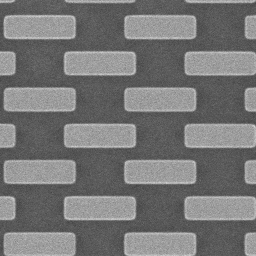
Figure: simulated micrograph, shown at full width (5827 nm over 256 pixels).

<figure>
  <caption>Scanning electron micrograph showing groups of lines, slits or small figures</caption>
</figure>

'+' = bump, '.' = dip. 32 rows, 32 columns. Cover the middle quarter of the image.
++++++++++++++++++............++
++++++++++++++++++............++
.++++++++++++++++..............+
................................
................................
................................
++..............++++++++++++++++
+++............+++++++++++++++++
+++............+++++++++++++++++
+++............+++++++++++++++++
+++............+++++++++++++++++
++..............++++++++++++++++
................................
................................
................................
++++++++++++++++++.............+
++++++++++++++++++............++
++++++++++++++++++............++
++++++++++++++++++............++
++++++++++++++++++............++
.++++++++++++++++..............+
................................
................................
................................
++..............++++++++++++++++
+++............+++++++++++++++++
+++............+++++++++++++++++
+++............+++++++++++++++++
+++............+++++++++++++++++
++.............+++++++++++++++++
................................
................................